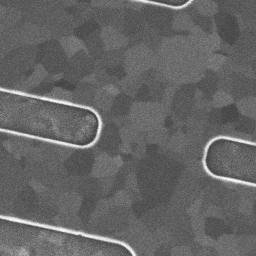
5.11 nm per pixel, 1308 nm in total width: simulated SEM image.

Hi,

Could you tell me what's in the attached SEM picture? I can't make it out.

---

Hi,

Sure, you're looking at one or a few lines or trenches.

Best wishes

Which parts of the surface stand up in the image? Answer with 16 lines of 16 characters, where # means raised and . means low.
################
################
################
################
################
################
....############
......##########
##....##########
#############...
#############...
################
################
################
....############
........########